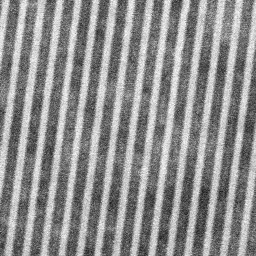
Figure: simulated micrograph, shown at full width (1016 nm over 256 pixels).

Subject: parallel lines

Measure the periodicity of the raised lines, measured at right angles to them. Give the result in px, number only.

17.8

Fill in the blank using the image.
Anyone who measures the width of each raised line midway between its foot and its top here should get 17.2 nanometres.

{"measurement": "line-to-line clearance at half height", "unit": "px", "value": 13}